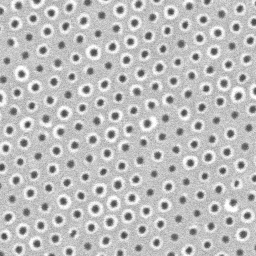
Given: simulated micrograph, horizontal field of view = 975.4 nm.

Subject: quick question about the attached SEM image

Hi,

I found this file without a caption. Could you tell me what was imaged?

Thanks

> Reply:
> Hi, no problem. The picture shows a regular array of holes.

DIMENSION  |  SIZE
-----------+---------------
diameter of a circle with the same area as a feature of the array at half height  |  27.9 nanometers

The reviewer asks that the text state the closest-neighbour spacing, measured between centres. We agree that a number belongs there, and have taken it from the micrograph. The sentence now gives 71.6 nm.